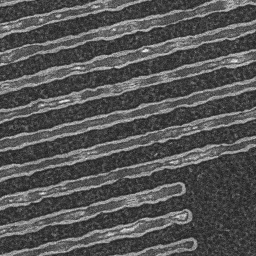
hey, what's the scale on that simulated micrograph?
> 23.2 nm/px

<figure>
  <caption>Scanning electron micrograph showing parallel lines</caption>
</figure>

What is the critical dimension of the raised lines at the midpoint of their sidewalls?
432 nm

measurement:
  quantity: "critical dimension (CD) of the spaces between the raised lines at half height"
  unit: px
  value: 9.36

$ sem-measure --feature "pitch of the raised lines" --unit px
28.1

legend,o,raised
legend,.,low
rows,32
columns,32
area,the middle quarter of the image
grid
o..............ooooooooooooooo..
.......ooooooooooooooooooooo....
..oooooooooooooooooooooo........
ooooooooooooooooooo..........ooo
oooooooooooooooo........oooooooo
ooooooooooo..........ooooooooooo
ooooo............ooooooooooooooo
oo............oooooooooooooooooo
........ooooooooooooooooooooo...
....ooooooooooooooooooooo.......
oooooooooooooooooooo.........o.o
ooooooooooooooooo..........ooooo
ooooooooooo...........oooooooooo
ooooooo...........oooooooooooooo
oooo..........oooooooooooooooooo
...........ooooooooooooooooooo..
......ooooooooooooooooooo.......
...oooooooooooooooooo..........o
oooooooooooooooo............oooo
oooooooooooo..........oooooooooo
oooooooo...........ooooooooooooo
ooooo.........o.oooooooooooooooo
o..........ooooooooooooooooooo..
.......ooooooooooooooooooo......
...ooooooooooooooooooo..........
oooooooooooooooooo............oo
ooooooooooooo..........ooooooooo
ooooooooooo..........ooooooooooo
ooooo..........ooooooooooooooooo
............oooooooooooooooooooo
.........oooooooooooooooo.....oo
...ooooooooooooooooooo........oo